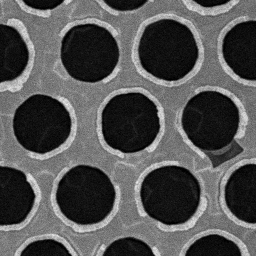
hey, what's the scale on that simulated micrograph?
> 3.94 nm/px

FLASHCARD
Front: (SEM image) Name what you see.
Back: holes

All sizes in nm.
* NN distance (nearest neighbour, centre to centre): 317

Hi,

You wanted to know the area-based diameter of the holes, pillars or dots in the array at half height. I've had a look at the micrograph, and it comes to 232 nanometres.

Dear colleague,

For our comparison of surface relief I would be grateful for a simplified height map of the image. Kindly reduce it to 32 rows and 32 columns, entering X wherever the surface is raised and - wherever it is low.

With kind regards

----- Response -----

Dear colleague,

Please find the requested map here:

XXX-----XXXXX-----XXXXXXX---XXXX
XXXXXXXXXXXXXXXXXXXXXXXXXXXXXXXX
XXXXXXXXXXXXXXXXXXXX--XXXXXXXXXX
--XXXXXXX----XXXXX-----XXXXXX---
---XXXXX------XXXX------XXXX----
---XXXXX-------XX--------XXX----
----XXXX-------XX--------XXX----
----XXXX-------XX--------XXX----
---XXXXX------XXXX------XXXXX---
--XXXXXXX-----XXXXX----XXXXXXX--
XXXXXXXXXXXXXXXXXXXXXXXXXXXXXXXX
XXXXXXXXXXXXXXXXXXXXXXXXX--XXXXX
XXX----XXXXXXX-----XXXXX-----XXX
XX------XXXXX-------XXX-------XX
XX-------XXXX-------XXX-------XX
XX-------XXXX-------XXX-------XX
XX-------XXXX-------XXX-------XX
XX------XXXXX------XXXXX-----XXX
XXX----XXXXXXX----XXXXXXX---X-XX
XXXXXXXXXXXXXXXXXXXXXXXXXX----XX
XXXXXXXXXXXXXXXXXXXXXXXXXXX-XXX-
---XXXXX-----XXXXXX-----XXXXX---
---XXXXX------XXXX-------XXXX---
----XXX-------XXXX-------XXX----
----XXX-------XXXX-------XXX----
----XXX-------XXXX-------XXX----
----XXXX------XXXX------XXXXX---
---XXXXXX----XXXXXXX---XXXXXXX--
XXXXXXXXXXXXXXXXXXXXXXXXXXXXXXXX
XXXXXXXXXXXXXXXXXXXXXXXXXX--XXXX
XXXX----XXXXXX----XXXXXX-----XXX
XXX------XXXX------XXXX-------XX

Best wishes